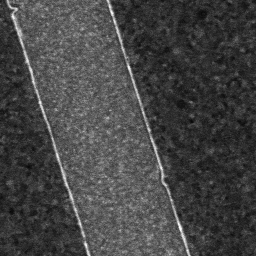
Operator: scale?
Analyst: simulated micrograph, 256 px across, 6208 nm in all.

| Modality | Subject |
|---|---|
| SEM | one or a few lines or trenches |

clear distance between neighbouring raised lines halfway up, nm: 2290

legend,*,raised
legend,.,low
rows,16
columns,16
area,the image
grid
*......*********
*......*********
*.......********
**......********
**......********
**......********
***......*******
***......*******
***......*******
****......******
****......******
****......******
****.......*****
*****......*****
*****......*****
*****.......****